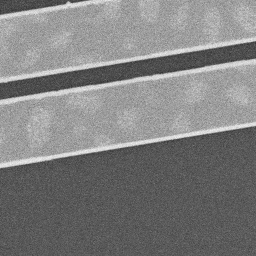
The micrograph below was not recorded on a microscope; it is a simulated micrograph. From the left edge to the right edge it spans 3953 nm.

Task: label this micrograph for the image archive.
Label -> one or a few lines or trenches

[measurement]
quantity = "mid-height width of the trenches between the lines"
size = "322 nm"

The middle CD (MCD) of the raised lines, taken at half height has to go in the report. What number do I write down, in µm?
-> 0.968